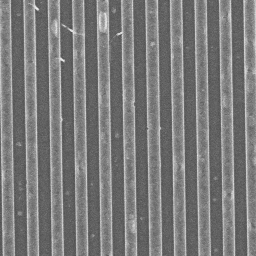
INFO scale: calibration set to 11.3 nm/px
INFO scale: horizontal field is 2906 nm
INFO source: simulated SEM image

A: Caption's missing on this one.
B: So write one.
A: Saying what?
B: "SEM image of parallel lines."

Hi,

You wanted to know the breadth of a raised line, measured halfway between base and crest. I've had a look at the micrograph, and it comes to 129 nm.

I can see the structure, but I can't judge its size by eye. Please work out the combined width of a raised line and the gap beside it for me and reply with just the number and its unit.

278 nm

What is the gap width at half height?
150 nanometers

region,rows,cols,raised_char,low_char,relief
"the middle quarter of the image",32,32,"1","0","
00111000011000011000011100011100
00111000011000011000011100011100
00111000011000011000011100011100
00111000011000011000011100011100
00111000011000011000011100011100
00111000011000011000011100011100
00111000011000011000011100011100
00011000011000011000011100011100
00011000011000011100011100011100
00011000011000011100011100011100
00011000011000011100011100011100
00011000011000011100011100011100
00011000011000011100011100011100
00011000011000011100011100011100
00011000011000011100011100011100
00011000011000011100011100011100
00011000011000011100011100011100
00011000011000011100011100011100
00011000011000011100011100011100
00011000011100011100011100011100
00011000011100011100011100011100
00011000011100011100011100011100
00011000011100011100011100011100
00011000011100011100011100011100
00011000011100011100011100011100
00011000011100011100011100011100
00011000011100011100011100011100
00011000011100011100011100011100
00011000011100011100011100011100
00011000011100011100011100011100
00011000011100011100011100011100
00011100011100011100011100011100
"